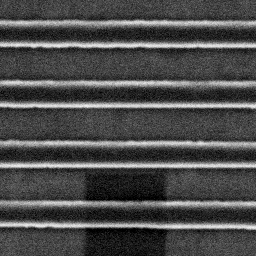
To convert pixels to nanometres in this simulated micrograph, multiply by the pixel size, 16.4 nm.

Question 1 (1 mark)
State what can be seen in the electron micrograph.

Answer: lines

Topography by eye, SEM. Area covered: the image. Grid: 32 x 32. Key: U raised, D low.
DDDDDDDDDDDDDDDDDDDDDDDDDDDDDDDD
DDDDDDDDDDDDDDDDDDDDDDDDDDDDDDDD
DDDDDDDDDDDDDDDDDDDDDDDDDDDDDDDD
UUUUUUUUUUUUUUUUUUUUUUUUUUUUUUUU
UUUUUUUUUUUUUUUUUUUUUUUUUUUUUUUU
UUUUUUUUUUUUUUUUUUUUUUUUUUUUUUUU
DDDDDDDDDDDDDDDDDDDDDDDDDDDDDDDD
DDDDDDDDDDDDDDDDDDDDDDDDDDDDDDDD
DDDDDDDDDDDDDDDDDDDDDDDDDDDDDDDD
DDDDDDDDDDDDDDDDDDDDDDDDDDDDDDDD
UUUUUUUUUUUUUUUUUUUUUUUUUUUUUUUU
UUUUUUUUUUUUUUUUUUUUUUUUUUUUUUUU
UUUUUUUUUUUUUUUUUUUUUUUUUUUUUUUU
DDDDDDDDDDDDDDDDDDDDDDDDDDDDDDDD
DDDDDDDDDDDDDDDDDDDDDDDDDDDDDDDD
DDDDDDDDDDDDDDDDDDDDDDDDDDDDDDDD
DDDDDDDDDDDDDDDDDDDDDDDDDDDDDDDD
DDDDDDDDDDDDDDDDDDDDDDDDDDDDDDDD
UUUUUUUUUUUUUUUUUUUUUUUUUUUUUUUU
UUUUUUUUUUUUUUUUUUUUUUUUUUUUUUUU
UUUUUUUUUUUUUUUUUUUUUUUUUUUUUUUU
DDDDDDDDDDDDDDDDDDDDDDDDDDDDDDDD
DDDDDDDDDDDDDDDDDDDDDDDDDDDDDDDD
DDDDDDDDDDDDDDDDDDDDDDDDDDDDDDDD
DDDDDDDDDDDDDDDDDDDDDDDDDDDDDDDD
UUUUUUUUUUUUUUUUUUUUUUUUUUUUUUUU
UUUUUUUUUUUUUUUUUUUUUUUUUUUUUUUU
UUUUUUUUUUUUUUUUUUUUUUUUUUUUUUUU
DDDDDDDDDDDDDDDDDDDDDDDDDDDDDDUU
DDDDDDDDDDDDDDDDDDDDDDDDDDDDDDDD
DDDDDDDDDDDDDDDDDDDDDDDDDDDDDDDD
DDDDDDDDDDDDDDDDDDDDDDDDDDDDDDDD